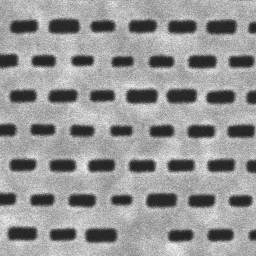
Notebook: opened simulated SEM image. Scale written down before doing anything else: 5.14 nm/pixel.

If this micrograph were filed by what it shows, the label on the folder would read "a regular array of holes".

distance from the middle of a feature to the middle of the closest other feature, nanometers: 201